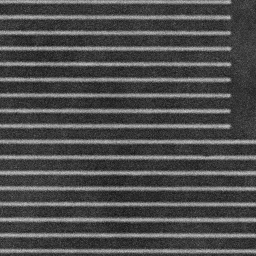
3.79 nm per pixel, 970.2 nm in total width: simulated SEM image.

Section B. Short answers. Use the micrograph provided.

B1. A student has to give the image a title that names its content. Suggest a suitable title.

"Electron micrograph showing parallel lines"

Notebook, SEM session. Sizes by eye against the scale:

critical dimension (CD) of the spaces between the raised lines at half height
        0.0474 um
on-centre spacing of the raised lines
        15.5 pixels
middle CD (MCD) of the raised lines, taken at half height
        10.9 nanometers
